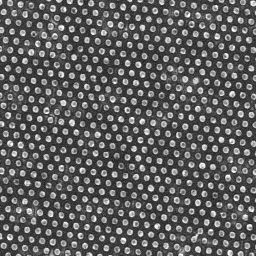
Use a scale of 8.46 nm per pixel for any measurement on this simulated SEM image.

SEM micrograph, a regular array of raised bodies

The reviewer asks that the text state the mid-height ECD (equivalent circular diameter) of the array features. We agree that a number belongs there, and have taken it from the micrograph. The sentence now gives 45.8 nanometres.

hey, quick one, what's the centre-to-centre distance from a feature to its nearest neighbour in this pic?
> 88.1 nm